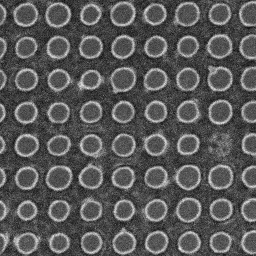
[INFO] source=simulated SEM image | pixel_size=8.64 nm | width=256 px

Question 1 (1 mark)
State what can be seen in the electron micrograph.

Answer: a regular array of raised bodies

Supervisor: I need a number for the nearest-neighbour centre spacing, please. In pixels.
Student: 32.1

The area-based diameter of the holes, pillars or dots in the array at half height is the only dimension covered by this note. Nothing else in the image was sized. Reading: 0.184 microns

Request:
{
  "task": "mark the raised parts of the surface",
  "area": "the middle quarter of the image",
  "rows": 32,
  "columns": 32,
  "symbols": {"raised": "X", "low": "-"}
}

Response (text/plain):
--------------------------------
-------------XXXX-----XX------XX
X----XXXX---XXXXXX---XXXX----XXX
X---XXXXX---XXXXXX--XXXXXX--XXXX
X---XXXXX---XXXXXX--XXXXXX--XXXX
X----XXXX---XXXXX---XXXXX----XXX
------------XXXX----------------
--------------------------------
--------------------------------
------XX------XX------XX------XX
X----XXXX----XXXX----XXXX----XXX
X---XXXXX---XXXXX----XXXX---XXXX
X---XXXXX---XXXXX---XXXXX---XXXX
X----XXXX----XXXX----XXXX----XXX
------X-------XX------XX--------
--------------------------------
--------------------------------
--------------------------------
X----XXXX----XXXX----XXXX----XXX
X---XXXXX----XXXXX---XXXXX---XXX
X---XXXXX---XXXXXX---XXXX----XXX
X---XXXXX---XXXXX----XXXX----XXX
------XX-----XXXX-----XX--------
--------------------------------
--------------------------------
------X-------------------------
X----XXXX----XXXX----XXXX----XXX
XX--XXXXX---XXXXX----XXXXX--XXXX
XX--XXXXX---XXXXX---XXXXX---XXXX
X---XXXXX---XXXXX----XXXX---XXXX
X----XXXX----XXXX----XXX-----XXX
--------------------------------